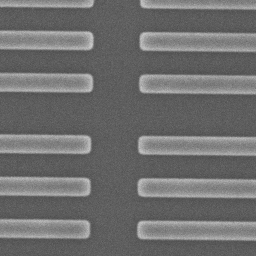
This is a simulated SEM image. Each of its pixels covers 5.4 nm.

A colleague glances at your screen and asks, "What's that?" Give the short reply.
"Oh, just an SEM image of groups of lines, slits or small figures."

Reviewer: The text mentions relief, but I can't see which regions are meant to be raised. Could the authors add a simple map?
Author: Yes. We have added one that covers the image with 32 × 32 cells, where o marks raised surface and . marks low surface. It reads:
oooooooooooo......oooooooooooooo
................................
................................
................................
oooooooooooo......oooooooooooooo
oooooooooooo......oooooooooooooo
................................
................................
................................
ooooooooooo.......ooooo.........
oooooooooooo......oooooooooooooo
..................oooooooooooooo
................................
................................
................................
................................
................................
ooooooooooo......ooooooooooooooo
ooooooooooo......ooooooooooooooo
................................
................................
................................
ooooooooooo.......ooooooooo.....
ooooooooooo......ooooooooooooooo
..................oooooooooooooo
................................
................................
ooooooo.........................
ooooooooooo......ooooooooooooooo
ooooooooooo......ooooooooooooooo
................................
................................